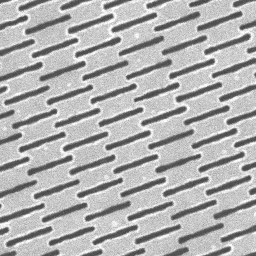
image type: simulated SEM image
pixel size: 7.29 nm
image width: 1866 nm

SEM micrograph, a regular array of holes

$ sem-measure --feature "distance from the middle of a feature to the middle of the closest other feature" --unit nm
178